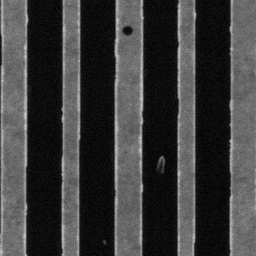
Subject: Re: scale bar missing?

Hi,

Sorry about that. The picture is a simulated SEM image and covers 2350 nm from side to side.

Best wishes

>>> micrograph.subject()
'lines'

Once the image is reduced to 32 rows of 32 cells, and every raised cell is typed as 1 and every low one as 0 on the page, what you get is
11100000110000011100001100000111
11100000110000011100001100000111
11100000110000011100001100000111
11100000110000011100001100000111
11100000110000011100001100000111
11100000110000011100001100000111
11100000110000111100001100000111
11100000110000011100001100000111
11100000110000011100001100000111
11100000110000011100001100000111
11100000110000111100001100000111
11100000110000111100001100000111
11100000110000111100001100000111
11100000110000111100001100000111
11100000110000111100001100000111
11100000110000111100001100000111
11100000110000111100001100000111
11100000110000111100001100000111
11100000110000111100001100000111
11100000110000111100001100000111
11100000110000111100001100000111
11100000110000111100001100000111
11100000110000111100001100000111
11100000110000111100001100000111
11100000110000111100001100000111
11100000110000111100001100000111
11100000110000111100001100000111
11100000110000111100001100000111
11100000110000111100001100000111
11100000110000111100001100000111
11100000110000111100001100000111
11100000110000111100001100000111